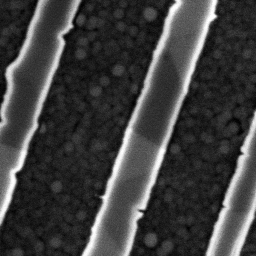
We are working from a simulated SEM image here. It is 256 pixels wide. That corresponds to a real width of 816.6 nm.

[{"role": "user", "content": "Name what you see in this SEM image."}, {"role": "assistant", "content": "one or a few lines or trenches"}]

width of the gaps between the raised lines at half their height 288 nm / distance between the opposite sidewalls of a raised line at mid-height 125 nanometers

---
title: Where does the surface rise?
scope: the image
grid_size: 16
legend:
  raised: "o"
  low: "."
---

..ooo......oo...
..oo......ooo...
..oo......ooo...
.ooo......oo....
.oo......ooo....
.oo......ooo....
ooo......oo.....
oo......ooo.....
oo......ooo.....
oo......oo.....o
o......ooo.....o
o......ooo....oo
o......oo.....oo
......ooo.....oo
......oo.....oo.
.....ooo.....oo.